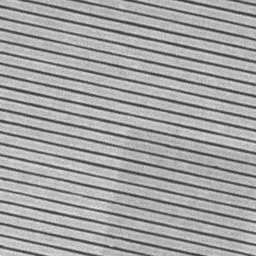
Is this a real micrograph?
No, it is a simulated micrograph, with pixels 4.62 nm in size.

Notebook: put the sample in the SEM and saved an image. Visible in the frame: parallel lines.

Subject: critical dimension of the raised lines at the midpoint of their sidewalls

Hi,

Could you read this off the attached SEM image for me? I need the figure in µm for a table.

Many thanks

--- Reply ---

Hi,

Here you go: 0.0379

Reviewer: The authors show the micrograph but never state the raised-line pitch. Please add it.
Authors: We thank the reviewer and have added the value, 0.0516 micrometres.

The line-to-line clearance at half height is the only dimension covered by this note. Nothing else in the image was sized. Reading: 12.5 nm